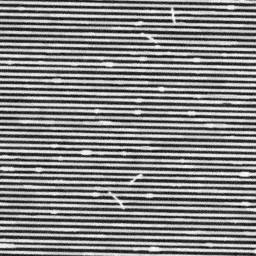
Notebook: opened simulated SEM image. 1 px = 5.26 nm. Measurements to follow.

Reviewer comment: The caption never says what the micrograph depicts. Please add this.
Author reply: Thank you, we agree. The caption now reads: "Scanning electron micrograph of parallel lines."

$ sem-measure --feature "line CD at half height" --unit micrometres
0.0145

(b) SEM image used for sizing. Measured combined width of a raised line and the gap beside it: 0.0313 µm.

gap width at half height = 0.0191 µm